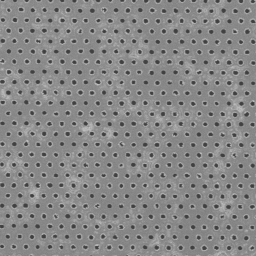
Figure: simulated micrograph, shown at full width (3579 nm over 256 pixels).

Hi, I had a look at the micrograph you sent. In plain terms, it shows a regular array of holes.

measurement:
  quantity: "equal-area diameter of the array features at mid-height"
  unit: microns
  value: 0.0601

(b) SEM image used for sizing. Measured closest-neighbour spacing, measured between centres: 0.16 micrometres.